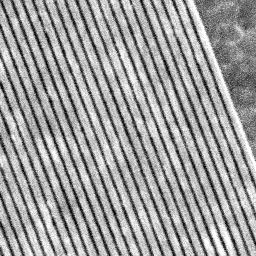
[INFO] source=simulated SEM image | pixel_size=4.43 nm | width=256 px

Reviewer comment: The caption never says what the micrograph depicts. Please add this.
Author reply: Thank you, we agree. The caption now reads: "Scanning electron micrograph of parallel lines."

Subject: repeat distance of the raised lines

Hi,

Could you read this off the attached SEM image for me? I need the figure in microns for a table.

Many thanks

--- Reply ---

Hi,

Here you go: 0.0445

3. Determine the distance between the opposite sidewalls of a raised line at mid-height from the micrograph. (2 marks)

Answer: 30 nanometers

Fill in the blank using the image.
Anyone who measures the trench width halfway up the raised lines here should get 17.1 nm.